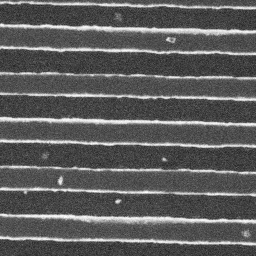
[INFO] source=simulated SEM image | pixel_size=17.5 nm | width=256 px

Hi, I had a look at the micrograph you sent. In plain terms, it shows lines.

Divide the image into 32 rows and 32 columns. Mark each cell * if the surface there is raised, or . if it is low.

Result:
......**************************
................................
................................
*************...................
********************************
********************************
..................**************
................................
................................
******************..............
********************************
********************************
................................
................................
................................
*******************************.
********************************
********************************
................................
................................
................................
*****************************...
********************************
********************************
................................
................................
................................
*************************.......
********************************
********************************
...............................*
................................